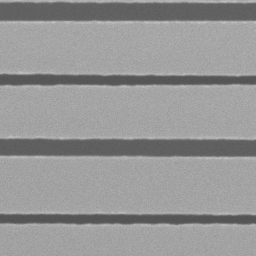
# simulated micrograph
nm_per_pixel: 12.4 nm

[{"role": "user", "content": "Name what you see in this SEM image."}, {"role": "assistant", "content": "lines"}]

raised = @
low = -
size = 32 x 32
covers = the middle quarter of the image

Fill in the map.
@@@@@@@@@@@@@@@@@@@@@@@@@@@@@@@@
@@@@@@@@@@@@@@@@@@@@@@@@@@@@@@@@
-@@@--@-@@@@-@@@@@@@@@@@@@@@@@@@
--------------------------------
--------------------------------
@@@@@@@@@@@@-@@@@@@@@@@@@@@@@@@@
@@@@@@@@@@@@@@@@@@@@@@@@@@@@@@@@
@@@@@@@@@@@@@@@@@@@@@@@@@@@@@@@@
@@@@@@@@@@@@@@@@@@@@@@@@@@@@@@@@
@@@@@@@@@@@@@@@@@@@@@@@@@@@@@@@@
@@@@@@@@@@@@@@@@@@@@@@@@@@@@@@@@
@@@@@@@@@@@@@@@@@@@@@@@@@@@@@@@@
@@@@@@@@@@@@@@@@@@@@@@@@@@@@@@@@
@@@@@@@@@@@@@@@@@@@@@@@@@@@@@@@@
@@@@@@@@@@@@@@@@@@@@@@@@@@@@@@@@
@@@@@@@@@@@@@@@@@@@@@@@@@@@@@@@@
@@@@@@@@@@@@@@@@@@@@@@@@@@@@@@@@
@@@@@@@@@@@@@@@@@@@@@@@@@@@@@@@@
@@@@@@@--@@@--@@@@--@@@@@@@@@@@@
--------------------------------
--------------------------------
--------------------------------
--------------------------------
@@@@@@@@@@@@@@@@@@@@@@@@@@@@@@@@
@@@@@@@@@@@@@@@@@@@@@@@@@@@@@@@@
@@@@@@@@@@@@@@@@@@@@@@@@@@@@@@@@
@@@@@@@@@@@@@@@@@@@@@@@@@@@@@@@@
@@@@@@@@@@@@@@@@@@@@@@@@@@@@@@@@
@@@@@@@@@@@@@@@@@@@@@@@@@@@@@@@@
@@@@@@@@@@@@@@@@@@@@@@@@@@@@@@@@
@@@@@@@@@@@@@@@@@@@@@@@@@@@@@@@@
@@@@@@@@@@@@@@@@@@@@@@@@@@@@@@@@